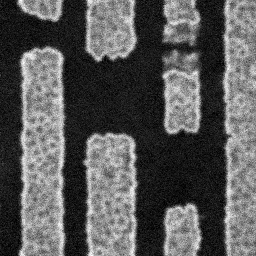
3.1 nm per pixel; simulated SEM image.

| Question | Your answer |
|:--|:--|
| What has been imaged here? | one or a few lines or trenches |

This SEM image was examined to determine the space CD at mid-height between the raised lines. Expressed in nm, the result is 87.1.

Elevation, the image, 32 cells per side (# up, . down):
...####....######....###....####
....###....######....####...####
...........#####.....####...####
...........#####............####
...........######...........####
...........######...........####
....###....#####............####
...#####....................####
...#####....................####
...#####.............####...####
...#####.............####...####
...#####.............####...####
...#####.............####...####
...#####.............####...####
...#####.............####...####
...#####.............####...####
...#####.....................###
...#####...#####.............###
...#####...######...........####
...#####...######............###
...#####...######............###
...####....######............###
...#####...######............###
...#####...######............###
...#####...######...........####
...#####...######............###
...#####...######....###....####
...#####...######....####...####
...#####...######....####...####
...#####...######....####...####
...#####...######....####...####
...#####...######....###....####